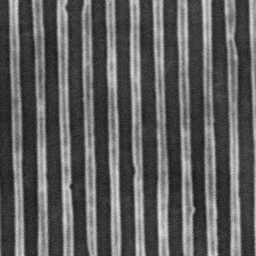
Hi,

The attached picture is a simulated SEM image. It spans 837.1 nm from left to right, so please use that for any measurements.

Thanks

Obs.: parallel lines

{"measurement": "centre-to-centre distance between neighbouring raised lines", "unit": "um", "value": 0.0785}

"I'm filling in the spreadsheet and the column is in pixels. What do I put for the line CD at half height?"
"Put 7.86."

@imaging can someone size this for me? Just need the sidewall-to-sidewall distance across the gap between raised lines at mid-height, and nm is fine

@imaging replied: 54.7